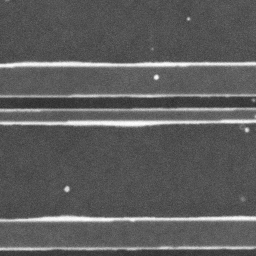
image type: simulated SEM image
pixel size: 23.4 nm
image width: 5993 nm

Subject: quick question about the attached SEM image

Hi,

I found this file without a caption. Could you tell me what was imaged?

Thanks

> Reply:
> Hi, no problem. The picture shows lines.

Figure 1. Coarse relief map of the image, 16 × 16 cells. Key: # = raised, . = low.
................
................
................
................
################
################
################
################
................
................
................
................
................
................
################
################